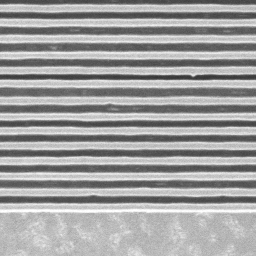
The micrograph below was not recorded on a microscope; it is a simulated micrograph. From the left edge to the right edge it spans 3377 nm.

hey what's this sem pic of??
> parallel lines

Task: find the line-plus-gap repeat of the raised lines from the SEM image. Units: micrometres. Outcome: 0.202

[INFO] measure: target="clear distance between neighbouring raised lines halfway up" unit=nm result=90.7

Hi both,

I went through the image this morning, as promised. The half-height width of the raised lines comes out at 104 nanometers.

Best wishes